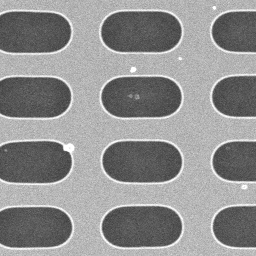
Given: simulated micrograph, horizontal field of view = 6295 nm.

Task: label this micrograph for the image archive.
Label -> groups of lines, slits or small figures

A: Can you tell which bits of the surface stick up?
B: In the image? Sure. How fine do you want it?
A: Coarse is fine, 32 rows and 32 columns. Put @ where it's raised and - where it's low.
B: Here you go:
@@@@@@@@@@@@@@@@@@@@@@@@@@@@@@@@
@-----@@@@@@@@@------@@@@@@@----
--------@@@@@---------@@@@@-----
---------@@@@----------@@@------
---------@@@@----------@@@------
--------@@@@@---------@@@@@-----
@------@@@@@@@@-----@@@@@@@@@---
@@@@@@@@@@@@@@@@@@@@@@@@@@@@@@@@
@@@@@@@@@@@@@@@@@@@@@@@@@@@@@@@@
@@@@@@@@@@@@@@@@@---@@@@@@@@@---
--------@@@@@---------@@@@@-----
---------@@@@----------@@@------
---------@@@@----------@@@------
---------@@@@---------@@@@@-----
@------@@@@@@@-------@@@@@@@----
@@@@@@@@@@@@@@@@@@@@@@@@@@@@@@@@
@@@@@@@@@@@@@@@@@@@@@@@@@@@@@@@@
@@@@@@@@@@@@@@@@@@@@@@@@@@@@@@@@
--------@@@@@---------@@@@@-----
---------@@@@----------@@@@-----
---------@@@@----------@@@@-----
---------@@@@---------@@@@@-----
--------@@@@@@-------@@@@@@@----
@@@@@@@@@@@@@@@@@@@@@@@@@@@@@@@@
@@@@@@@@@@@@@@@@@@@@@@@@@@@@@@@@
@@@@@@@@@@@@@@@@@@@@@@@@@@@@@@@@
--------@@@@@@--------@@@@@-----
---------@@@@----------@@@@-----
---------@@@@----------@@@@-----
---------@@@@----------@@@@-----
--------@@@@@@--------@@@@@@----
@@@@@@@@@@@@@@@@@@@@@@@@@@@@@@@@